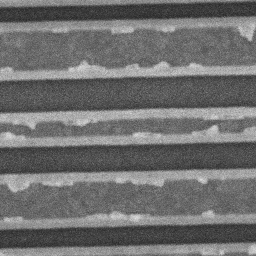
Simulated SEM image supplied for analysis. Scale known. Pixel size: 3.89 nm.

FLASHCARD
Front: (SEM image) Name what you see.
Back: one or a few lines or trenches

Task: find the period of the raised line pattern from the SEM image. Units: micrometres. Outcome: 0.293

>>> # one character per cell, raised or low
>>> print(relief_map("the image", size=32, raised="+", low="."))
................................
................................
................................
++++++++++++++++++++++++++++++++
++++++++++++++++++++++++++++++++
++++++++++++++++++++++++++++++++
++++++++++++++++++++++++++++++++
++++++++++++++++++++++++++++++++
++++++++++++++++++++++++++++++++
................................
................................
................................
................................
................................
..........++..++++++++++++++++++
++++++++++++++++++++++++++++++++
++++++++++++++++++++++++++++++++
+++++++++++.++++................
................................
................................
................................
................................
++++++++++++++++++++++++++++++++
++++++++++++++++++++++++++++++++
++++++++++++++++++++++++++++++++
++++++++++++++++++++++++++++++++
++++++++++++++++++++++++++++++++
+++++++++++++++++++..+++........
................................
................................
................................
.......+++..++++++++++++++++++++